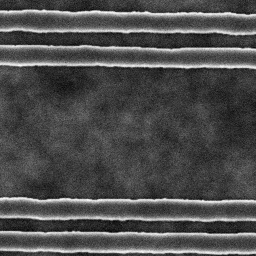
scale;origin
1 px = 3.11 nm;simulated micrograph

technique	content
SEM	lines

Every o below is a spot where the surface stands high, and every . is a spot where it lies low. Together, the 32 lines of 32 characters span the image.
................................
oooooooo...oo...................
oooooooooooooooooooooooooooooooo
oooooooooooooooooooooooooooooooo
................................
................................
oooooooooooooooooooooooooooooooo
oooooooooooooooooooooooooooooooo
...............................o
................................
................................
................................
................................
................................
................................
................................
................................
................................
................................
................................
................................
................................
................................
................................
................................
oooooooooooooooooooooooooooooooo
oooooooooooooooooooooooooooooooo
.................ooooo.ooooooooo
................................
oooooooooooooooooooooooooooooooo
oooooooooooooooooooooooooooooooo
.......ooo.ooooooooooooooooooooo